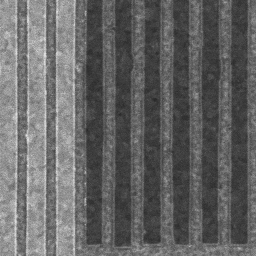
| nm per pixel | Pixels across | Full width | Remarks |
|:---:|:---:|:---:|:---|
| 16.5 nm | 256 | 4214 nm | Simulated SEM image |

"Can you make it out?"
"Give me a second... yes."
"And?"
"parallel lines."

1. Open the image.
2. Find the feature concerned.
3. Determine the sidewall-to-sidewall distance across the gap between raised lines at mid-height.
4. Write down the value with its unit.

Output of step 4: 181 nanometres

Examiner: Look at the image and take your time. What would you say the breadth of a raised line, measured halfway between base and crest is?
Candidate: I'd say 296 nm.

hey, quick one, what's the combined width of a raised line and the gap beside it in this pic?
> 0.477 µm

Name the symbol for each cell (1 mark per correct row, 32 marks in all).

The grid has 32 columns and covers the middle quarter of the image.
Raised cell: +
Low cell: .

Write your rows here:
++....++++...++++...++++...++++.
++...+++++...++++...++++...++++.
++...+++++...++++...++++...++++.
++...+++++...++++...++++...++++.
++....++++...++++...++++...++++.
++....++++...++++...++++...++++.
++....++++...++++...++++...++++.
++....++++...++++...++++...++++.
++....++++...++++...++++...++++.
++....++++...++++...++++...++++.
++....++++...++++...++++...+++++
++....++++...++++...++++...+++++
+++...++++...++++...++++...+++++
+++...++++...++++...++++...+++++
+++...++++...++++...++++...+++++
+++...++++...++++...++++...+++++
+++...++++...++++...++++...+++++
+++...++++...++++...++++...+++++
+++...++++...++++...++++...+++++
+++...++++...++++...++++...+++++
+++...++++...++++...++++...+++++
+++...++++...++++...++++...+++++
+++...++++...++++...++++...+++++
+++...++++...++++...++++...+++++
+++...++++...++++...++++...+++++
+++...++++...++++...++++...+++++
+++...++++...++++...++++...+++++
+++...++++...++++...++++...+++++
+++...++++...++++...++++...+++++
+++...++++...++++...++++...+++++
+++...++++...++++...++++...+++++
+++...++++...++++...++++...+++++